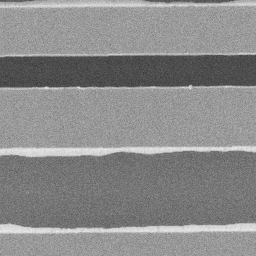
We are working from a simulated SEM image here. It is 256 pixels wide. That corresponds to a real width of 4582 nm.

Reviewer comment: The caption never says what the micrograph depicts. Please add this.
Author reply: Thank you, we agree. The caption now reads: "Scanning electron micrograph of lines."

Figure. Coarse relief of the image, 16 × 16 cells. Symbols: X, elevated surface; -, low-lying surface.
XXXXXXXXXXXXXXXX
XXXXXXXXXXXXXXXX
XXXXXXXXXXXXXXXX
----------------
----------------
XXXXXXXXXXXXXXXX
XXXXXXXXXXXXXXXX
XXXXXXXXXXXXXXXX
XXXXXXXXXXXXXXXX
----------------
----------------
----------------
----------------
----------------
XXXXXXXXXXXXXXXX
XXXXXXXXXXXXXXXX